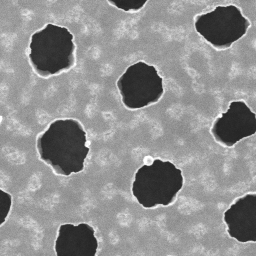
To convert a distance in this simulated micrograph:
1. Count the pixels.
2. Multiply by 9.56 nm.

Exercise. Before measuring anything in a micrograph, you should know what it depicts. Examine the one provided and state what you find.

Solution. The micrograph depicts holes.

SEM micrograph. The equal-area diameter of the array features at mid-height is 445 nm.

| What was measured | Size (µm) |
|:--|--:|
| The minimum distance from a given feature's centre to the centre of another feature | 0.933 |